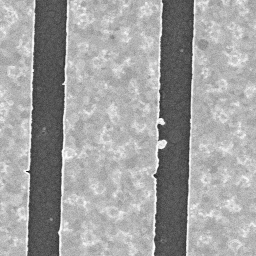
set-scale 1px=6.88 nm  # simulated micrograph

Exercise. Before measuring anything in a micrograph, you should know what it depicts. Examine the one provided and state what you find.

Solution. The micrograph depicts one or a few lines or trenches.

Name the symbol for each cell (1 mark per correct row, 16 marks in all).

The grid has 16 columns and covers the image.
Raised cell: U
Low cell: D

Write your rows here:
UUDDUUUUUUDDUUUU
UUDDUUUUUUDDUUUU
UUDDUUUUUUDDUUUU
UUDDUUUUUUDDUUUU
UUDDUUUUUUDDUUUU
UUDDUUUUUUDDUUUU
UUDDUUUUUUDDUUUU
UUDDUUUUUUDDUUUU
UUDDUUUUUUDDUUUU
UUDDUUUUUUDDUUUU
UUDDUUUUUUDDUUUU
UUDDUUUUUUDDUUUU
UUDDUUUUUUDDUUUU
UUDDUUUUUUDDUUUU
UUDDUUUUUUDDUUUU
UUDDUUUUUUDDUUUU